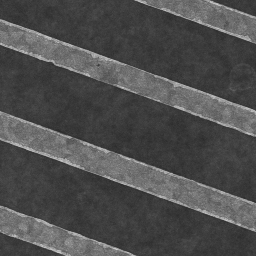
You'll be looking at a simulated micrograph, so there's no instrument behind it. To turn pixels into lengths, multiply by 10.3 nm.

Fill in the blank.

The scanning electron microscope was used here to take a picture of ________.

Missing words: one or a few lines or trenches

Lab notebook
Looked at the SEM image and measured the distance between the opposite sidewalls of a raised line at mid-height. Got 251 nanometers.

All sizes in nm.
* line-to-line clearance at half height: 649